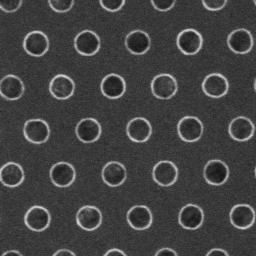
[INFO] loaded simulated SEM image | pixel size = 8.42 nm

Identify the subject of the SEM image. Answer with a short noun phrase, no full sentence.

a regular array of raised bodies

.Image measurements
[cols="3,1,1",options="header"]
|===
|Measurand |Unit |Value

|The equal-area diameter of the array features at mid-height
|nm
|202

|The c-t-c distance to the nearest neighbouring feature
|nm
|425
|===